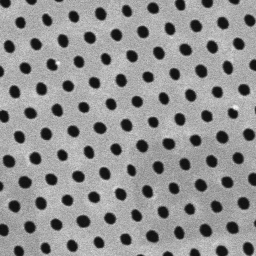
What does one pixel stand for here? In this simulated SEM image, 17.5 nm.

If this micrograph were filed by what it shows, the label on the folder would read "a regular array of holes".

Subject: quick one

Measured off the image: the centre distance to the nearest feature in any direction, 0.457 um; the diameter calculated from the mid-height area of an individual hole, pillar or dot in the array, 215 nanometers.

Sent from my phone